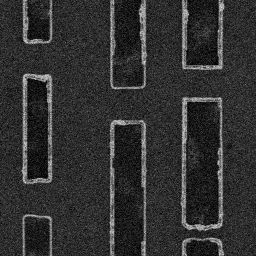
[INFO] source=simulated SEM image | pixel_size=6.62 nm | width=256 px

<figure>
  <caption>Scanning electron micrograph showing one or a few lines or trenches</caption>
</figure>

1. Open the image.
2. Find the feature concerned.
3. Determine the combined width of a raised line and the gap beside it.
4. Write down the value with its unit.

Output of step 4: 0.538 micrometres